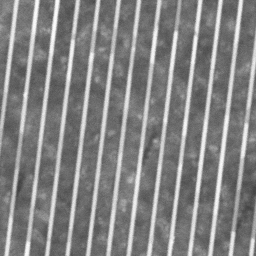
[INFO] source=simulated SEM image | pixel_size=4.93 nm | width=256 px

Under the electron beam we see parallel lines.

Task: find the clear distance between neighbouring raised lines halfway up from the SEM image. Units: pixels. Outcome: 17.6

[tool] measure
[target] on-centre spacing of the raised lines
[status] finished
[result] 0.0999 micrometres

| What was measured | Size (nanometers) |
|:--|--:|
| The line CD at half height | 12.2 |